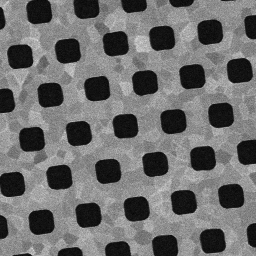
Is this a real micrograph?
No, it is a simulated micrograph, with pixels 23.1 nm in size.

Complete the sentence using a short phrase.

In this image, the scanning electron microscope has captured a regular array of holes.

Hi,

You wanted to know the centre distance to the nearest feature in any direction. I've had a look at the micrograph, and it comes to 47.2 px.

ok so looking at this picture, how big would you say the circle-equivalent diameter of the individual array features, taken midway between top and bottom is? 0.618 microns